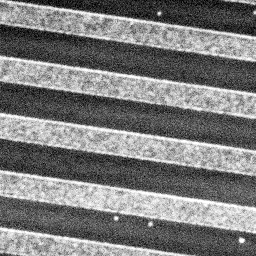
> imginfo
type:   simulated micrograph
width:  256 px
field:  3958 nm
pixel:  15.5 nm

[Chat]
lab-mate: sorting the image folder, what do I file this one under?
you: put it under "lines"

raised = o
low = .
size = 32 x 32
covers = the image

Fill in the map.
ooo.............................
oooooooooo......................
ooooooooooooooooo...............
....ooooooooooooooooooo.........
...........oooooooooooooooooooo.
..................oooooooooooooo
.........................ooooooo
ooo............................o
ooooooooo.......................
oooooooooooooooo................
...oooooooooooooooooooo.........
..........oooooooooooooooooooo..
.................ooooooooooooooo
........................oooooooo
oo............................oo
oooooooo........................
ooooooooooooooo.................
..ooooooooooooooooooooo.........
.........oooooooooooooooooooo...
................oooooooooooooooo
.......................ooooooooo
o............................ooo
ooooooo.........................
ooooooooooooooo.................
.ooooooooooooooooooooo..........
........oooooooooooooooooooo....
...............ooooooooooooooooo
.....................ooooooooooo
............................oooo
oooooo..........................
oooooooooooooo..................
.ooooooooooooooooooo............